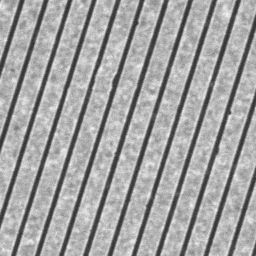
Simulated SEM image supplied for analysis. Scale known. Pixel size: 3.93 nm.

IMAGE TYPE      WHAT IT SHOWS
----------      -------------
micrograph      parallel lines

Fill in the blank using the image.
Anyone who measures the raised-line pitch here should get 90.1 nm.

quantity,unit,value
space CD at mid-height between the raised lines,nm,24.8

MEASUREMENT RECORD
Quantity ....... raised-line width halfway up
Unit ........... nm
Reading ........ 67